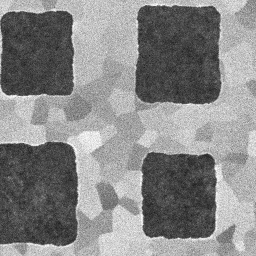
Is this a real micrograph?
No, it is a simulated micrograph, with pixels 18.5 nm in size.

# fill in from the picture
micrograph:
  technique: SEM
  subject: holes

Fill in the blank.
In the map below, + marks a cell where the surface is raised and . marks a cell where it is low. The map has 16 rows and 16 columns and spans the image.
+++++++++....+++
.....++++.....++
.....++++.....++
.....++++.....++
.....++++.....++
.....+++......++
++++++++++++.+++
++++++++++++++++
++++++++++++++++
.....+++++++++++
.....++++.....++
.....++++....+++
.....++++.....++
.....++++.....++
.....++++....+++
++++++++++++++++